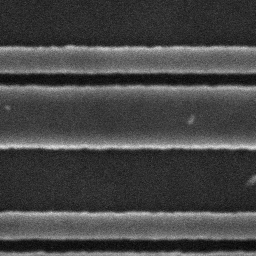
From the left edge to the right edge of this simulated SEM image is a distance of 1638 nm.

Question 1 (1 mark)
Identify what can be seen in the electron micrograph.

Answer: lines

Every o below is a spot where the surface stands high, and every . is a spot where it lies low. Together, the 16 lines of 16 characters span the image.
................
................
................
oooooooooooooooo
oooooooooooooooo
oooooooooooooooo
oooooooooooooooo
oooooooooooooooo
oooooooooooooooo
................
................
................
................
oooooooooooooooo
oooooooooooooooo
oooooooooooooooo